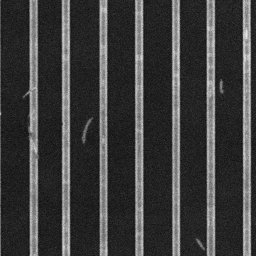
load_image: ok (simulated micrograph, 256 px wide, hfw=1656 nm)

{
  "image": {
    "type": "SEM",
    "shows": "parallel lines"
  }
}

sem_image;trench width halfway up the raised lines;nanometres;188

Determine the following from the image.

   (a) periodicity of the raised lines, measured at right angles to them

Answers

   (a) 230 nm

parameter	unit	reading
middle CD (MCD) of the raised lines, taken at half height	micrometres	0.0469